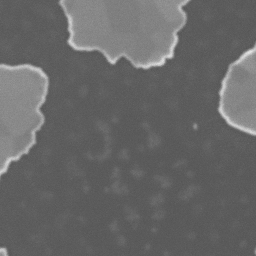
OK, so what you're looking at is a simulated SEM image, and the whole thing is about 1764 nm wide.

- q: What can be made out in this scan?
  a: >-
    raised bodies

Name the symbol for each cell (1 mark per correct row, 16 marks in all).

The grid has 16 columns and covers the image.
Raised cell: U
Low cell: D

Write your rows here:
DDDDUUUUUUUDDDDD
DDDDUUUUUUUDDDDD
DDDDUUUUUUUDDDDD
DDDDDDDUUUUDDDDU
UUUDDDDDDDDDDDUU
UUUDDDDDDDDDDDUU
UUUDDDDDDDDDDDUU
UUUDDDDDDDDDDDUU
UUDDDDDDDDDDDDDD
UUDDDDDDDDDDDDDD
DDDDDDDDDDDDDDDD
DDDDDDDDDDDDDDDD
DDDDDDDDDDDDDDDD
DDDDDDDDDDDDDDDD
DDDDDDDDDDDDDDDD
DDDDDDDDDDDDDDDD